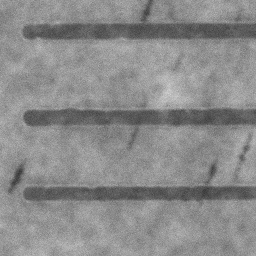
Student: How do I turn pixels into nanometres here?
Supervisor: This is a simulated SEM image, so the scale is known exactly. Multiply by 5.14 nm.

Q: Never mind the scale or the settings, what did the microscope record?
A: one or a few lines or trenches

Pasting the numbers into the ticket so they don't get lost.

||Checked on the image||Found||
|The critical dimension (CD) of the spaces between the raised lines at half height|325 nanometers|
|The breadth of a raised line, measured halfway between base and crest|0.0907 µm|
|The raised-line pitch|417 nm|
